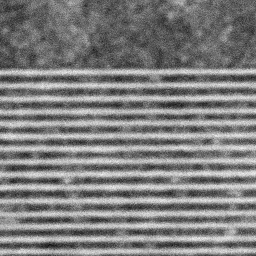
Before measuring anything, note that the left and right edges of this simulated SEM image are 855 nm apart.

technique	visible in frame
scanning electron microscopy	parallel lines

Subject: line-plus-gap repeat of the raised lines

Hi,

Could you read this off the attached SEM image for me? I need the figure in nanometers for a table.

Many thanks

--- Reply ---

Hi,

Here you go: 42.7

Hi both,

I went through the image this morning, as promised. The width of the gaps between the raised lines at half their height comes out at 31.3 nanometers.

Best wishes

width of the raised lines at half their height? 12.5 nanometers